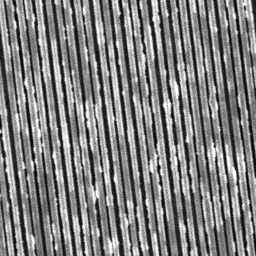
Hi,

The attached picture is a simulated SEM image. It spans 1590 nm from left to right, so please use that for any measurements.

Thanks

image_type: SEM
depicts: parallel lines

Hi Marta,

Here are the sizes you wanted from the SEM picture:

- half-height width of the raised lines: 37 nanometers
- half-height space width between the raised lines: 3.96 px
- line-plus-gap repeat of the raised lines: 59.2 nanometres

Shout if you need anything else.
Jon